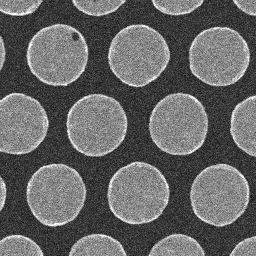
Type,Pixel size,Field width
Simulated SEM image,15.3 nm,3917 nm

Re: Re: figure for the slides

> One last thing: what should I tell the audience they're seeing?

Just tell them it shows a regular array of raised bodies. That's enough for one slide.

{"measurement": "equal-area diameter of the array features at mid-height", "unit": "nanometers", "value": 918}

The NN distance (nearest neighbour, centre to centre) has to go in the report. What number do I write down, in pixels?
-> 80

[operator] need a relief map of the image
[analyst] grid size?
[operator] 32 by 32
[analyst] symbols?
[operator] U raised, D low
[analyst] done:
UUUUUDDDDUUUUUUDDDDUUUUUUDDDDDUU
UUUUDDDDDDUUUUDDDDDDUUUUDDDDDDDU
DDDDDDDDDDDDDDDDDDDDDDDDDDDDDDDD
DDDDDDUUUDDDDDDDUUUDDDDDDDDDDDDD
DDDDUUUUUUDDDDUUUUUUDDDDDUUUUUDD
DDDDUUUUUUUDDDUUUUUUUDDDUUUUUUUD
UDDUUUUUUUUDDDUUUUUUUDDDUUUUUUUD
DDDUUUUUUUUDDDUUUUUUUDDDUUUUUUUD
DDDDUUUUUUUDDDUUUUUUUDDDUUUUUUUD
DDDDDUUUUUDDDDDUUUUUDDDDDUUUUUDD
DDDDDDUUUDDDDDDDUUDDDDDDDDUUUDDD
DDDDDDDDDDDDDDDDDDDDDDDDDDDDDDDD
UUUUDDDDDDUUUUDDDDDDUUUUUDDDDDDU
UUUUUDDDDUUUUUUDDDDUUUUUUDDDDUUU
UUUUUUDDDUUUUUUUDDDUUUUUUUDDDUUU
UUUUUUDDUUUUUUUUDDDUUUUUUUDDDUUU
UUUUUUDDDUUUUUUUDDDUUUUUUUDDDUUU
UUUUUDDDDUUUUUUDDDDUUUUUUDDDDUUU
UUUUDDDDDDUUUUDDDDDDUUUUUDDDDDUU
DDDDDDDDDDDDDDDDDDDDDDDDDDDDDDDD
DDDDDDDDDDDDDDDDUUDDDDDDDDDDDDDD
DDDDDUUUUUDDDDDUUUUUDDDDDUUUUUDD
DDDDUUUUUUDDDDUUUUUUUDDDUUUUUUUD
UDDDUUUUUUUDDDUUUUUUUDDDUUUUUUUD
UDDUUUUUUUUDDDUUUUUUUDDDUUUUUUUD
DDDDUUUUUUDDDDUUUUUUUDDDUUUUUUUD
DDDDUUUUUUDDDDUUUUUUDDDDUUUUUUDD
DDDDDUUUUDDDDDDUUUUDDDDDDUUUUDDD
DDDDDDDDDDDDDDDDDDDDDDDDDDDDDDDD
DDDDDDDDDDDUUDDDDDDDDUUDDDDDDDDD
UUUUDDDDDUUUUUUDDDDDUUUUUDDDDDUU
UUUUUDDDDUUUUUUUDDDUUUUUUDDDDUUU